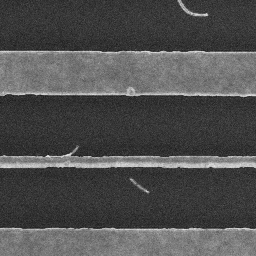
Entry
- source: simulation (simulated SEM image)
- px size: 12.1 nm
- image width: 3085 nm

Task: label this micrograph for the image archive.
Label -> lines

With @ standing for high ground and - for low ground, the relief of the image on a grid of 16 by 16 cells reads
----------------
----------------
----------------
@@@@@@@@@@@@@@@@
@@@@@@@@@@@@@@@@
@@@@@@@@@@@@@@@@
----------------
----------------
----------------
----------------
----------------
----------------
----------------
----------------
@@@@@@@@@@@@@@@@
@@@@@@@@@@@@@@@@